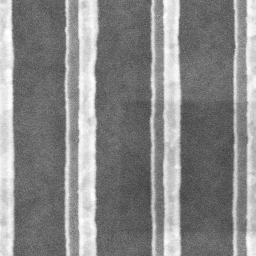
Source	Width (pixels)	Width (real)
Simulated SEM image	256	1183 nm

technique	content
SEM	lines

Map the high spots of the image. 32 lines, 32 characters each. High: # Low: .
#.......####.......###.......###
#.......####.......###.......###
#.......####.......###........##
#.......####.......###........##
#.......####.......###........##
#.......####.......###........##
##......####.......###.......###
##......####.......###.......###
#.......####.......###.......###
#.......####.......###.......###
#.......####.......###.......###
#.......####.......###.......###
#.......####.......###.......###
#.......####.......###.......###
#.......####.......###.......###
#.......####.......###.......###
#.......####.......###.......###
#.......####.......###........##
#.......####.......###.......###
#.......####.......###........##
#.......####.......###........##
#.......####.......###........##
#.......####.......###........##
#.......####.......###........##
#.......####.......###.......###
#.......####.......###.......###
#.......####.......###.......###
#.......####.......###.......###
#.......####.......###.......###
#.......####.......###.......###
#.......####.......###.......###
#........###.......###.......###